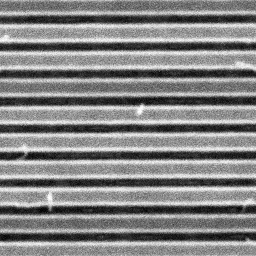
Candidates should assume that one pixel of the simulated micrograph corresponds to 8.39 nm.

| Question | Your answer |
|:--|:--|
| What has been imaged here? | parallel lines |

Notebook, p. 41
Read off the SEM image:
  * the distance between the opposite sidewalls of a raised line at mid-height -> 143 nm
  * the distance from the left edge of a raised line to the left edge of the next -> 228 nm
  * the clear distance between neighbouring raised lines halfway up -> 92.3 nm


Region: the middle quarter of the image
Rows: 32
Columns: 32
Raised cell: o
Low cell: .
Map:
oooooooooooooooooooooooooooooooo
................................
................................
................................
oooooooooooooooooooooooooooooooo
oooooooooooooooooooooooooooooooo
oooooooooooooooooooooooooooooooo
oooooooooooooooooooooooooooooooo
................................
................................
...................o............
oooooooooooooooooooooooooooooooo
oooooooooooooooooooooooooooooooo
oooooooooooooooooooooooooooooooo
oooooooooooooooooooooooooooooooo
................................
................................
....oooooo.ooooooooooooooooooooo
oooooooooooooooooooooooooooooooo
oooooooooooooooooooooooooooooooo
oooooooooooooooooooooooooooooooo
ooooo...........................
................................
................................
o..ooooooooooooooooooooooooooooo
oooooooooooooooooooooooooooooooo
oooooooooooooooooooooooooooooooo
oooooooooooooooooooooooooooooooo
o.o.............................
................................
................................
oooooooooooooooooooooooooooooooo